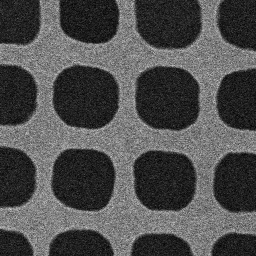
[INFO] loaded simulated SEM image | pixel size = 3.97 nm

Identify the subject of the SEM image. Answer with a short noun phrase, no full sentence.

holes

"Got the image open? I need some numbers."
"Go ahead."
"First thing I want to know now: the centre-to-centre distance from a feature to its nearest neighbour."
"323 nm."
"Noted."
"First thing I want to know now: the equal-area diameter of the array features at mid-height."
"66 px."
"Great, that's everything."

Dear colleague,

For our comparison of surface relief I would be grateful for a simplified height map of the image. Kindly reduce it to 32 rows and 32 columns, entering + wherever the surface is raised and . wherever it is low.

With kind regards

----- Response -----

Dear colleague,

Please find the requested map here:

.....++........++........++.....
.....++........++........++.....
.....+++.......++........++.....
.....+++.......++........++.....
.....+++......++++.......+++....
++..+++++++++++++++.....+++++...
++++++++++++++++++++++++++++++++
++++++++++++++++++++++++++++++++
...+++++....+++++++....+++++++++
....+++.......+++.......++++....
.....++........++........+++....
.....++........++........++.....
.....++........++........++.....
.....++........++........++.....
....+++.......+++........++.....
...+++++.....+++++......++++....
++++++++++++++++++++++++++++++++
++++++++++++++++++++++++++++++++
..++++++++++++++++++++++++++++++
....+++.......+++......+++++....
....+++.......+++.......+++.....
....+++.......+++.......+++.....
....++........+++........++.....
....++........+++.......+++.....
....+++.......+++.......+++.....
...+++++.....+++++......+++.....
+++++++++++++++++++++++++++++.++
++++++++++++++++++++++++++++++++
++++++++++++++++++++++++++++++++
...++++......+++++....++++++....
....++........+++.......+++.....
....++........++........++......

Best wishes